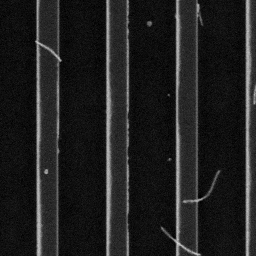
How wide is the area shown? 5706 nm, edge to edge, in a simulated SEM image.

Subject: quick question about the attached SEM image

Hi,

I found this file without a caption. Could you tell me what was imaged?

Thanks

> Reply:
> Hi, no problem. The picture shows lines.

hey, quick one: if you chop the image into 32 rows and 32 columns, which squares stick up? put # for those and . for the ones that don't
.....##......###......###......#
.....##......###......###......#
.....##......###......###......#
.....##......###......###......#
.....##......###......###......#
.....##......###......###......#
.....##......###......###......#
.....##......###......###......#
.....##......###......###......#
.....##......###......###......#
.....##......###......###......#
.....##......###......###......#
.....##......###......###......#
.....##......###......###......#
.....##......###......###......#
.....##......###......###......#
.....##......###......###......#
.....##......###......###......#
.....##......###......###......#
.....##......###......###......#
.....##......###......###......#
.....##......###......###......#
.....##......###......###......#
.....##......###......###......#
.....##......###......###......#
.....##......###......###......#
.....##......###......###......#
.....##......###......###......#
.....##......###......###......#
.....##......###......###......#
.....##......###......###......#
.....##......###......###......#